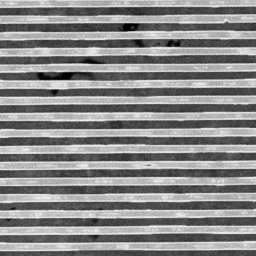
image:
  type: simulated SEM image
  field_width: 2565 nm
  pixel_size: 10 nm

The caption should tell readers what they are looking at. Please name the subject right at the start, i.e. parallel lines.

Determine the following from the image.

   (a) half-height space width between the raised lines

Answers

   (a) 97.7 nanometres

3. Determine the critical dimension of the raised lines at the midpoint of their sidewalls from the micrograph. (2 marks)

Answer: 71.4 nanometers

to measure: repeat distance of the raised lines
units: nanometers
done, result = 163